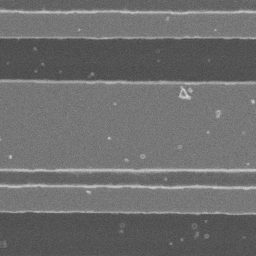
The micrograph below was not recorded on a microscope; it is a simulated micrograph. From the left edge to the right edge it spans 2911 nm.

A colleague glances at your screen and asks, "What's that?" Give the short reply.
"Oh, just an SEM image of lines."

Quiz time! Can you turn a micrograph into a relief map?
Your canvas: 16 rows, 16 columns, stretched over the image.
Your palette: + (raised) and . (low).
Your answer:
++++++++++++++++
++++++++++++++++
................
................
................
++++++++++++++++
++++++++++++++++
++++++++++++++++
++++++++++++++++
++++++++++++++++
++++++++++++++++
++++++++++++++++
++++++++++++++++
................
................
................